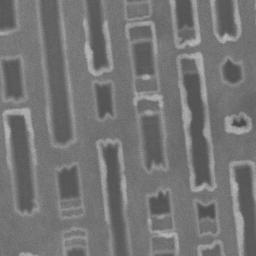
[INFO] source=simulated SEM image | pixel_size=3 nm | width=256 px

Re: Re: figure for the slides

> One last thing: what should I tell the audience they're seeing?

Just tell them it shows parallel lines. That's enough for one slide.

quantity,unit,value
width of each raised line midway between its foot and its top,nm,81.5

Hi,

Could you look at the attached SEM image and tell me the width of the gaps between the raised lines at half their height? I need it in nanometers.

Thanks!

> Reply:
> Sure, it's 50.9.